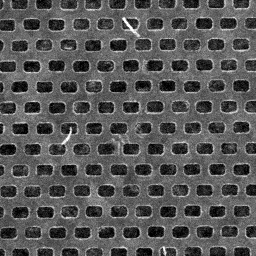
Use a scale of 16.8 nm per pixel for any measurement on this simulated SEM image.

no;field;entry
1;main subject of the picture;a regular array of holes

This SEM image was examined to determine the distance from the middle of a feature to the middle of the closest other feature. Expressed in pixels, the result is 23.8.